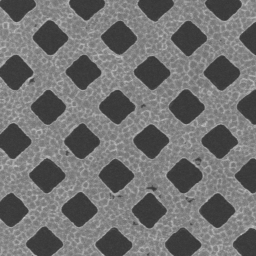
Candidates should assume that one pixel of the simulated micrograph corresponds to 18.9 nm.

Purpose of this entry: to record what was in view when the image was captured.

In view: a regular array of holes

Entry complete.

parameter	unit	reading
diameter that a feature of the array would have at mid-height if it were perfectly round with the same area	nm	586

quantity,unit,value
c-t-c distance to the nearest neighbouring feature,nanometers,898